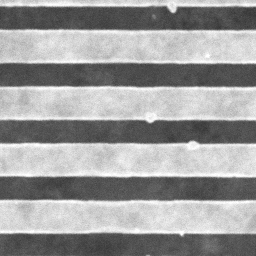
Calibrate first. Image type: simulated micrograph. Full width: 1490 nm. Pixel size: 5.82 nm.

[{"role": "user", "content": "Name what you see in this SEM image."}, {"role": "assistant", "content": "wiring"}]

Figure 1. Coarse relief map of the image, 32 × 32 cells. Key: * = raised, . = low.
*******************.************
................................
................................
................................
********************************
********************************
********************************
**************..****************
................................
................................
................................
********************************
********************************
********************************
********************************
................................
................................
................................
********************************
********************************
********************************
********************************
................................
................................
................................
*************..*****************
********************************
********************************
********************************
................................
................................
................................